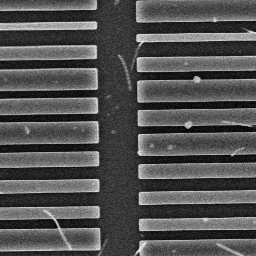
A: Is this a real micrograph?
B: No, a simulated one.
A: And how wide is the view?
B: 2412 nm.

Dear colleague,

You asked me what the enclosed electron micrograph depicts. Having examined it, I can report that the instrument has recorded groups of lines, slits or small figures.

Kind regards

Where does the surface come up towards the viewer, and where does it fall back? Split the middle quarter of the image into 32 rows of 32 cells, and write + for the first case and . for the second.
..................++++++++++++++
++++++++..........++++++++++++++
++++++++........................
++++++++........................
++++++++...........+++++++++++++
++++++++...........+++++++++++++
...................+++++++++++++
...................+++++++++++++
.....+++...........+++++++++++++
++++++++...........++...........
++++++++........................
++++++++.....................+++
...................+++++++++++++
...................+++++++++++++
...................+++++++++++++
++++++++......................++
++++++++........................
++++++++..................++++++
++++++++...........+++++++++++++
++++++++...........+++++++++++++
...................+++++++++++++
...................+++++++++++++
++++++++...........+++++++++++++
++++++++........................
++++++++........................
++.................+++++++++++++
...................+++++++++++++
...................+++++++++++++
...................+++++++++++++
+++++++++.......................
+++++++++.......................
+++++++++.......................